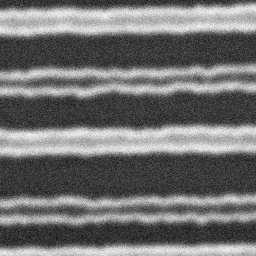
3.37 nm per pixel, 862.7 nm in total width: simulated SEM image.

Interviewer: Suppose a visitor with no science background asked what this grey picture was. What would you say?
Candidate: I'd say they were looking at lines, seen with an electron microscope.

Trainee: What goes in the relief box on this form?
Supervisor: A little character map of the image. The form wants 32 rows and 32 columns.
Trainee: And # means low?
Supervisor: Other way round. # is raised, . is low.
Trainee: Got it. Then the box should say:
................................
.#.#############################
################################
################################
................................
................................
................................
................................
..............................##
################################
################################
############....................
................................
................................
................................
................................
......#.########..##############
################################
################################
................................
................................
................................
................................
................................
................................
################################
################################
###########.#.....#......#......
................................
................................
................................
################################